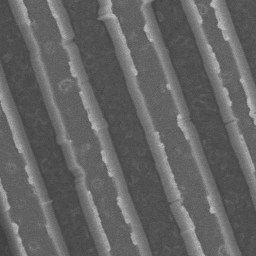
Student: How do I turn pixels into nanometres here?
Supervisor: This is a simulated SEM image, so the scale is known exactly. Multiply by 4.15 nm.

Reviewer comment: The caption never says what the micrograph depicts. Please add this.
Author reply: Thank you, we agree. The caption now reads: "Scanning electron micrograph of one or a few lines or trenches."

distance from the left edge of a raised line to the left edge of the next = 339 nanometers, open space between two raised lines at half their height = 161 nanometres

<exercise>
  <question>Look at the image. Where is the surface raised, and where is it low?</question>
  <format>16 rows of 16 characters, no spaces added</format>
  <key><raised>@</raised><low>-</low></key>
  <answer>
-@@@--@@@---@@--
-@@@---@@@--@@--
--@@---@@@---@@-
--@@@---@@---@@-
--@@@---@@@--@@-
---@@---@@@---@@
@--@@@---@@---@@
@--@@@---@@@--@@
@---@@@--@@@---@
@@--@@@---@@---@
@@---@@---@@@--@
@@---@@@--@@@---
@@@--@@@---@@@--
@@@---@@---@@@--
-@@---@@@---@@--
-@@@--@@@---@@@-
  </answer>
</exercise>